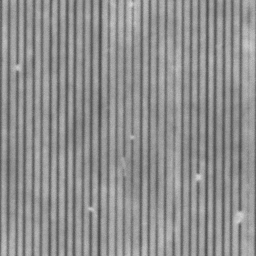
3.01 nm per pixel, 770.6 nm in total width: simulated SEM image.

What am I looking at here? parallel lines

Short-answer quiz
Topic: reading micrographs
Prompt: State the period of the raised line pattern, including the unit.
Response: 24.8 nm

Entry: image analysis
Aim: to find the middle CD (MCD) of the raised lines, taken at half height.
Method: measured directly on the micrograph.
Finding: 17.7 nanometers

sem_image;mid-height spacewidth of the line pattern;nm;6